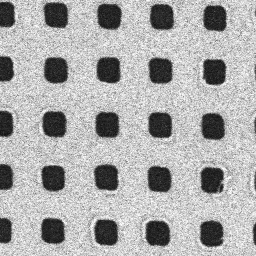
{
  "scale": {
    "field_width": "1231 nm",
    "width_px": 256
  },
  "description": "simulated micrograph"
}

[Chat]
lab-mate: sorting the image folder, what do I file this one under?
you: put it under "a regular array of holes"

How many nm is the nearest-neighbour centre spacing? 254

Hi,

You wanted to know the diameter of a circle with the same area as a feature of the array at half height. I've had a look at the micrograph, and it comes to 124 nanometres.